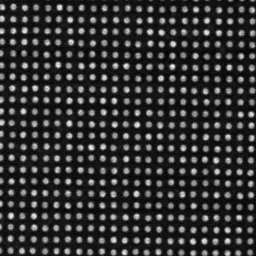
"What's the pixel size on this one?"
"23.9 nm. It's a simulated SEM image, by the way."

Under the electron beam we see a regular array of raised bodies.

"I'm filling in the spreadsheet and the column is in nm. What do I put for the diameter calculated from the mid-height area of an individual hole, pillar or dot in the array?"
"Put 123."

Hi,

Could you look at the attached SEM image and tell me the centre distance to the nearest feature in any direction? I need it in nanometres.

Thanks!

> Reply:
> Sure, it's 262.